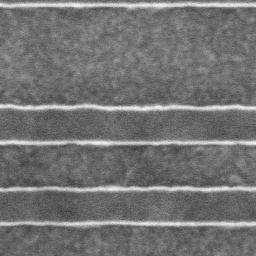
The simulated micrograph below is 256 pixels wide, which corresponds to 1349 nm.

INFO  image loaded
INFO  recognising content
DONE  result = lines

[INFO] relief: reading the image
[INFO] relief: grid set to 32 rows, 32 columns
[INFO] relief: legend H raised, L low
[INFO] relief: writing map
HHHHHHHHHHHHHHHHHHHHHHHHHHHHHHHH
LLLLLLLLLLLLLLLLLLLLLLLLLLLLLLLL
LLLLLLLLLLLLLLLLLLLLLLLLLLLLLLLL
LLLLLLLLLLLLLLLLLLLLLLLLLLLLLLLL
LLLLLLLLLLLLLLLLLLLLLLLLLLLLLLLL
LLLLLLLLLLLLLLLLLLLLLLLLLLLLLLLL
LLLLLLLLLLLLLLLLLLLLLLLLLLLLLLLL
LLLLLLLLLLLLLLLLLLLLLLLLLLLLLLLL
LLLLLLLLLLLLLLLLLLLLLLLLLLLLLLLL
LLLLLLLLLLLLLLLLLLLLLLLLLLLLLLLL
LLLLLLLLLLLLLLLLLLLLLLLLLLLLLLLL
LLLLLLLLLLLLLLLLLLLLLLLLLLLLLLLL
LLLLLLLLLLLLLLLLLLLLLLLLLLLLLLLL
HHHHHHHHHHHHHHHHHHHHHHHHHHHHHHHH
HHHHHHHHHHHHHHHHHHHHHHHHHHHHHHHH
HHHHHHHHHHHHHHHHHHHHHHHHHHHHHHHH
HHHHHHHHHHHHHHHHHHHHHHHHHHHHHHHH
HHHHHHHHHHHHHHHHHHHHHHHHHHHHHHHH
LLLLLLLLLLLLLLLLLLLLLLLLLLLLLLLL
LLLLLLLLLLLLLLLLLLLLLLLLLLLLLLLL
LLLLLLLLLLLLLLLLLLLLLLLLLLLLLLLL
LLLLLLLLLLLLLLLLLLLLLLLLLLLLLLLL
LLLLLLLLLLLLLLLLLLLLLLLLLLLLLLLL
LLLLLHHHLLLLLLLLLLHHHHHHLLLLHHLL
HHHHHHHHHHHHHHHHHHHHHHHHHHHHHHHH
HHHHHHHHHHHHHHHHHHHHHHHHHHHHHHHH
HHHHHHHHHHHHHHHHHHHHHHHHHHHHHHHH
HHHHHHHHHHHHHHHHHHHHHHHHHHHHHHHH
LLLLLLLLLLLLLLLLLLLLLLLLLLLLLLLL
LLLLLLLLLLLLLLLLLLLLLLLLLLLLLLLL
LLLLLLLLLLLLLLLLLLLLLLLLLLLLLLLL
LLLLLLLLLLLLLLLLLLLLLLLLLLLLLLLL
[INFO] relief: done